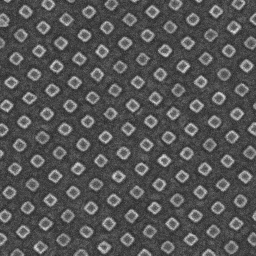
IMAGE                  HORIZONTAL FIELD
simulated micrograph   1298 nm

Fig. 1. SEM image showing a regular array of raised bodies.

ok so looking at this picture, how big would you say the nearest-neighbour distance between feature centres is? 120 nanometers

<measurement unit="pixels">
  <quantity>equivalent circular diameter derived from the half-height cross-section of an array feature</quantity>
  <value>11.5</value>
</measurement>